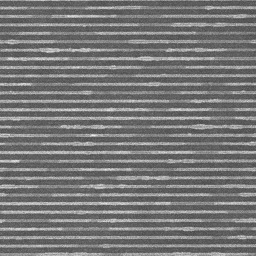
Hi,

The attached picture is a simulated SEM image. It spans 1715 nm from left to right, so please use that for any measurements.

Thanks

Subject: parallel lines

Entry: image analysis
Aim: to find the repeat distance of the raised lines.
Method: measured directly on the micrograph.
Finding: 56.9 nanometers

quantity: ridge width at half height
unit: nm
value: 15.9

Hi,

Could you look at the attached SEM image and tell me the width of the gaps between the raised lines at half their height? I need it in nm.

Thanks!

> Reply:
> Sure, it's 40.2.